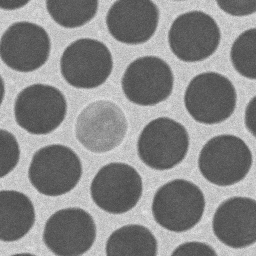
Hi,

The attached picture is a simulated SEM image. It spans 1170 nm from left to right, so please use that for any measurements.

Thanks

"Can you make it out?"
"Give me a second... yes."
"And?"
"a regular array of holes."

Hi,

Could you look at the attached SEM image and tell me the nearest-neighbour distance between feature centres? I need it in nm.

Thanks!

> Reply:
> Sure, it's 291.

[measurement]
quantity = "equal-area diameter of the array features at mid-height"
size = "234 nanometers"